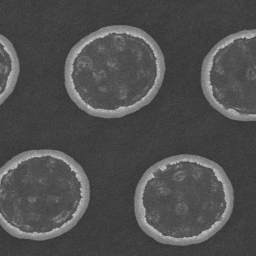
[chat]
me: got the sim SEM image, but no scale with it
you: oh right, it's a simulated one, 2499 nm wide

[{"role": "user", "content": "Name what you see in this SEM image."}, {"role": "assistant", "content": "raised bodies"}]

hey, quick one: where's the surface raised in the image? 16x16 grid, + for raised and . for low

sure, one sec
................
................
.....++++.....++
+...++++++...+++
+...++++++...+++
+...++++++...+++
.....++++....+++
................
................
................
+++++.....++++..
+++++....+++++..
+++++....+++++..
+++++....+++++..
.+++.....++++...
................